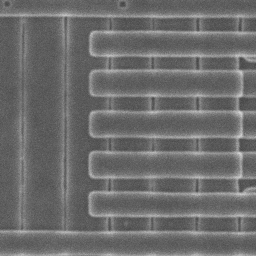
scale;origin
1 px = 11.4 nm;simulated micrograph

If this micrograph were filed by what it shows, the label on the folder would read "wiring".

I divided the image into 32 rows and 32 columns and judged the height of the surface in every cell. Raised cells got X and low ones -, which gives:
XXXXXXXXXXXXXXX-XXXXXXXXXXXXXXXX
XXXXXXXXXXXXXXXXXXXXXXXXXXXXXXXX
--------------------------------
--------------------------------
-----------XXXXXXXXXXXXXXXXXXXXX
-----------XXXXXXXXXXXXXXXXXXXXX
-----------XXXXXXXXXXXXXXXXXXXXX
--------------------------------
--------------------------------
-----------XXXXXXXXXXXXXXXXXXX--
-----------XXXXXXXXXXXXXXXXXXX--
-----------XXXXXXXXXXXXXXXXXXX--
--------------------------------
--------------------------------
-----------XXXXXXXXXXXXXXXXXXX--
-----------XXXXXXXXXXXXXXXXXXX--
-----------XXXXXXXXXXXXXXXXXXX--
--------------------------------
--------------------------------
-----------XXXXXXXXXXXXXXXXXXX--
-----------XXXXXXXXXXXXXXXXXXX--
-----------XXXXXXXXXXXXXXXXXXX--
--------------------------------
--------------------------------
-----------XXXXXXXXXXXXXXXXXXXXX
-----------XXXXXXXXXXXXXXXXXXXXX
-----------XXXXXXXXXXXXXXXXXXXXX
--------------------------------
--------------------------------
XXXXXXXXXXXXXXXXXXXXXXXXXXXXXXXX
XXXXXXXXXXXXXXXXXXXXXXXXXXXXXXXX
XXXXXXXXXXXXXXXXXXXXXXXXXXXXXXXX